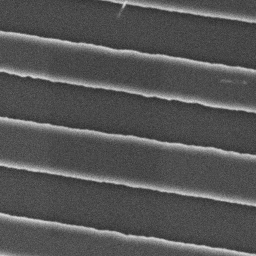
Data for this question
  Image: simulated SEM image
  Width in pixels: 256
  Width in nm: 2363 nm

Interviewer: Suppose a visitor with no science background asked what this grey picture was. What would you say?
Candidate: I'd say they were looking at lines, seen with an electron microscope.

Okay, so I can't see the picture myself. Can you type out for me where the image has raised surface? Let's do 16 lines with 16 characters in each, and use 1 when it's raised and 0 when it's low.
0000000000111111
0000000000000000
1111000000000000
1111111111000000
1111111111111111
0000001111111111
0000000000000111
1000000000000000
1111111100000000
1111111111111110
0111111111111111
0000000111111111
0000000000000011
1000000000000000
1111111000000000
1111111111111000